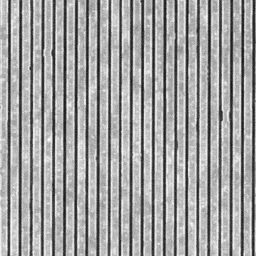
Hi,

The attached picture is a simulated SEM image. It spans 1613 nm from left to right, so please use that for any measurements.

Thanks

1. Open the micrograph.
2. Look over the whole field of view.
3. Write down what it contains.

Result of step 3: parallel lines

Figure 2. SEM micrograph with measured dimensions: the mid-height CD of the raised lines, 49.6 nanometres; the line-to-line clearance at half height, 22 nanometers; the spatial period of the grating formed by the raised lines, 0.0699 µm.